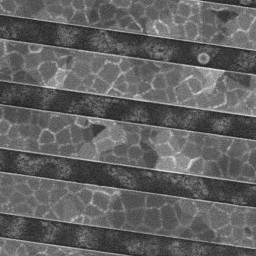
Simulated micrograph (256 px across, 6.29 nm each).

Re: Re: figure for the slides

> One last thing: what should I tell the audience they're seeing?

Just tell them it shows one or a few lines or trenches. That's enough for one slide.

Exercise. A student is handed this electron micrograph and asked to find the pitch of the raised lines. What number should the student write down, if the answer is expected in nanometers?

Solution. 413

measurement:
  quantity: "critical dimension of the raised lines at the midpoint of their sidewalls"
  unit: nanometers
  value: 260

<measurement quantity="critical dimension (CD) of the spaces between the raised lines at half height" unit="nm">149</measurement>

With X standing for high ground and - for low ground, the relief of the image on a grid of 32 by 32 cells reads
XXXXXXXXXXXXXXXXXXXXXXXXXXXX----
XXXXXXXXXXXXXXXXXXXXXXXXXXXXXXXX
-----XXXXXXXXXXXXXXXXXXXXXXXXXXX
------------XXXXXXXXXXXXXXXXXXXX
-------------------XXXXXXXXXXXXX
XXXX----------------------XXXXXX
XXXXXXXXXXXX--------------------
XXXXXXXXXXXXXXXXXXX------X------
XXXXXXXXXXXXXXXXXXXXXXXXXX------
XXXXXXXXXXXXXXXXXXXXXXXXXXXXXXXX
---XXXXXXXXXXXXXXXXXXXXXXXXXXXXX
----------XXXXXXXXXXXXXXXXXXXXXX
-----------------XXXXXXXXXXXXXXX
XXX---------------------XXXXXXXX
XXXXXXXXXX---------------------X
XXXXXXXXXXXXXXXXX---------------
XXXXXXXXXXXXXXXXXXXXXXXX--------
XXXXXXXXXXXXXXXXXXXXXXXXXXXXXXX-
XXXXXXXXXXXXXXXXXXXXXXXXXXXXXXXX
-------XXXXXXXXXXXXXXXXXXXXXXXXX
--------------XXXXXXXXXXXXXXXXXX
---------------------XXXXXXXXXXX
XXXXXXX---------------------XXXX
XXXXXXXXXXXXXX------------------
XXXXXXXXXXXXXXXXXXXXX-----------
XXXXXXXXXXXXXXXXXXXXXXXXXXXX----
XXXXXXXXXXXXXXXXXXXXXXXXXXXXXXXX
------XXXXXXXXXXXXXXXXXXXXXXXXXX
-------------XXXXXXXXXXXXXXXXXXX
--------------------XXXXXXXXXXXX
XXXXX----------------------XXXXX
XXXXXXXXXXXX--------------------